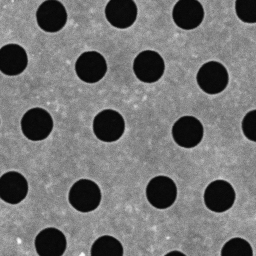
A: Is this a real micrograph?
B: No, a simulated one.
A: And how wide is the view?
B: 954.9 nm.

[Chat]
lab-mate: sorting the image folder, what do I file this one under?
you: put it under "a regular array of holes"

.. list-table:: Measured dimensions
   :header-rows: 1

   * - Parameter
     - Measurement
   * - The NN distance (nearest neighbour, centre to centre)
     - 59.5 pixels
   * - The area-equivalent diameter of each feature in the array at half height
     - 120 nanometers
